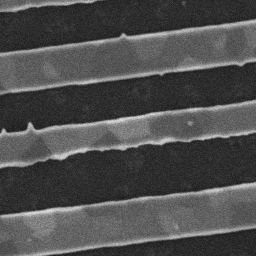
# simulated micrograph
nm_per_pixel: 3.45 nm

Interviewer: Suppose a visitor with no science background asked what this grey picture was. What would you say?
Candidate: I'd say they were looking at one or a few lines or trenches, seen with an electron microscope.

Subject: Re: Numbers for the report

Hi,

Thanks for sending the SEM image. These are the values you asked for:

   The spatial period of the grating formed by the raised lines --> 0.278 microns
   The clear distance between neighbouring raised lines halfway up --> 141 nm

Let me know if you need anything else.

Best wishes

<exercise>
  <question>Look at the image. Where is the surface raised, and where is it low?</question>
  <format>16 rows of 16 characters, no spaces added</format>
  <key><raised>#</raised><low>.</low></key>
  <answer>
##..............
..............##
......##########
################
###########.....
###.............
...............#
.......#########
###############.
#####...........
................
................
........########
################
##############..
######..........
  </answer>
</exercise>